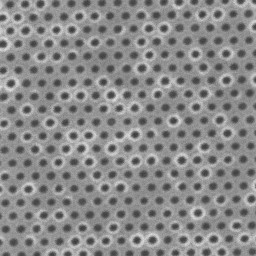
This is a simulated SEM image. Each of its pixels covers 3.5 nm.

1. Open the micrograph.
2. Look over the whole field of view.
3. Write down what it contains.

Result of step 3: a regular array of holes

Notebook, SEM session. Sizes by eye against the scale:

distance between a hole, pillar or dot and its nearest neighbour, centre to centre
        52.7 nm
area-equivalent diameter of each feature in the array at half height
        30.4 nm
